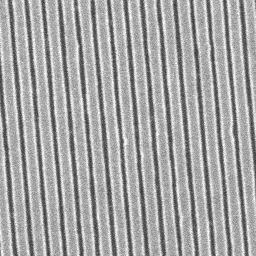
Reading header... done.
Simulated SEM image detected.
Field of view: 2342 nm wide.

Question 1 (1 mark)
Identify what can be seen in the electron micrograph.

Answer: parallel lines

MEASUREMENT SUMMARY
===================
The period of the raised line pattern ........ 0.15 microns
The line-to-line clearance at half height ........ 0.0535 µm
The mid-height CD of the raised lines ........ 97.9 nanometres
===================